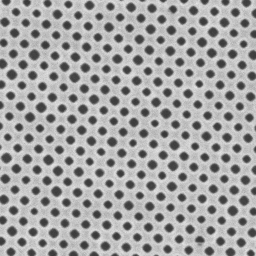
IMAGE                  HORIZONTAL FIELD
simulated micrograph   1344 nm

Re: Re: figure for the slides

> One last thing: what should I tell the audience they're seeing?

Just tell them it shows a regular array of holes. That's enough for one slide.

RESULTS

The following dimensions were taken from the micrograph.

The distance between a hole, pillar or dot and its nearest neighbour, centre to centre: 0.0758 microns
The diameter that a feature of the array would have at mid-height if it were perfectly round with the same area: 45.5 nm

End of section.